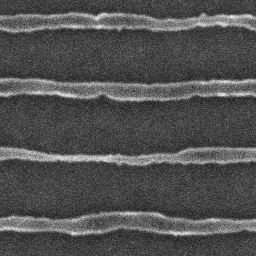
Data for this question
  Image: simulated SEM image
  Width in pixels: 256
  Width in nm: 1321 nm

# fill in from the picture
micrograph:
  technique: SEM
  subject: one or a few lines or trenches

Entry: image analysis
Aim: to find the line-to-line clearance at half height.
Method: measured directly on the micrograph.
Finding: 55.5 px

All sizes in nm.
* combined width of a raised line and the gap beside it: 348